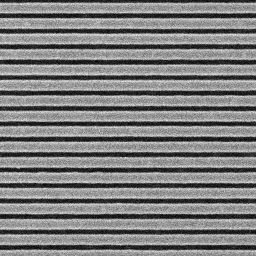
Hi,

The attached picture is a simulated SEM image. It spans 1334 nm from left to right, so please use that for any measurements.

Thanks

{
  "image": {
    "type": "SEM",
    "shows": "parallel lines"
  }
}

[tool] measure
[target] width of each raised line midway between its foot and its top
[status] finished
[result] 54 nm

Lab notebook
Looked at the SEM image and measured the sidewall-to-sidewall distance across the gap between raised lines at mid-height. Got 5.62 pixels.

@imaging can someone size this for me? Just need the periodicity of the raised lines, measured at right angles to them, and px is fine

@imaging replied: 15.5